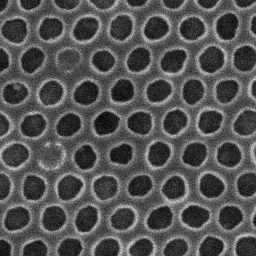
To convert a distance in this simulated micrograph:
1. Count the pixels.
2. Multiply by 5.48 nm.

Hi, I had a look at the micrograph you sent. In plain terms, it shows a regular array of holes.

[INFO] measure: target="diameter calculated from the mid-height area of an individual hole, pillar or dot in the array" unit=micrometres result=0.136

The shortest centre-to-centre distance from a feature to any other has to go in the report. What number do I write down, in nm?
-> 190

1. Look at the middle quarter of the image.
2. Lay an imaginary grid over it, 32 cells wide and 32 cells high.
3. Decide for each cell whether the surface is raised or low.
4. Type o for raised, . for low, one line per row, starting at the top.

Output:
ooooooo.....oooo.....ooo......oo
oooooooo...ooooo....ooooo....ooo
oooooooooooooooooooooooooo..oooo
oooooooooooooooooooooooooooooooo
ooooo..oooooo....ooooo.....oooo.
oooo.....oooo....oooo......ooo..
ooo......ooo......ooo......ooo..
oo.......ooo......oo.......ooo..
ooo......ooo.....oooo.....oooo..
ooo.....oooo....oooooo..oooooo..
oooooooooooooooooooooooooooooooo
ooooooooooooooooooooooooooo..ooo
o..oooooo....oooo....ooooo....oo
....oooo......oo......ooo......o
....ooo.......oo......ooo......o
....ooo.......oo......ooo......o
....oooo.....oooo.....ooo.....oo
...ooooo...ooooooo...ooooo..oooo
oooooooooooooooooooooooooooooooo
oooooooooooooooooooooo...ooooooo
oooo...ooooooo...oooo.....ooooo.
ooo....ooooo.....oooo......ooo..
ooo.....ooo......oooo......ooo..
oo......ooo......oooo.....ooo...
ooo.....oooo....ooooo.....oooo..
oooo....oooooooooooooo..oooooooo
oooooooooooooooooooooooooooooooo
oooooooooooooooooooooooooooooooo
....oooo.....oooo.....oooo....oo
.....oo......ooo......ooo.....oo
.....oo......ooo......ooo......o
....ooo......ooo......oo.......o